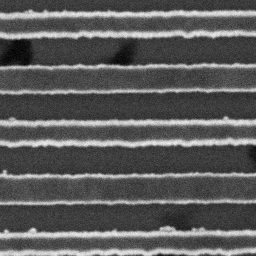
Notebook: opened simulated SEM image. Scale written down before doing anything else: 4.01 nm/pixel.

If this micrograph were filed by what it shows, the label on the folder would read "lines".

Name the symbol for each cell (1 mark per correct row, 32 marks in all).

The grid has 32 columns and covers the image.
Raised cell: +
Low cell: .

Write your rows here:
................................
................................
++++++++++++++++++++++++++++++++
++++++++++++++++++++++++++++++++
++++............................
................................
................................
................................
++++++++++++++++++++++++++++++++
++++++++++++++++++++++++++++++++
++++++++++++++++++++++++++++++++
++++++++++++++..................
................................
................................
................................
++++++++++++++++++++++++++++++++
++++++++++++++++++++++++++++++++
++++++++++++++++++++++++++++++++
................................
................................
................................
................................
++++++++++++++++++++++++++++++++
++++++++++++++++++++++++++++++++
++++++++++++++++++++++++++++++++
+++++++.+....+..+...............
................................
................................
................................
++++++++++++++++++++++++++++++++
++++++++++++++++++++++++++++++++
++++++++++++++++++++++++++++++++